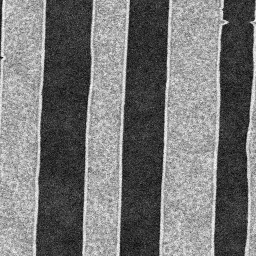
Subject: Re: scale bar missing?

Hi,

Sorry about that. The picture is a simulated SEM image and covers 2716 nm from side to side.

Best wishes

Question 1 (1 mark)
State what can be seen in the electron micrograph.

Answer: one or a few lines or trenches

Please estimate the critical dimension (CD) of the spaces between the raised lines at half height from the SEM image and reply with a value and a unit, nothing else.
453 nm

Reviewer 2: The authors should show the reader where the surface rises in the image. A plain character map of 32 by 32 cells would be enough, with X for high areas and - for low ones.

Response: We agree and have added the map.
XXXXXX------XXXX-----XXXXXXX----
XXXXXX------XXXX-----XXXXXXX----
XXXXXX------XXXX-----XXXXXXX----
XXXXX-------XXXX-----XXXXXXX----
XXXXX-------XXXX-----XXXXXX-----
XXXXX-------XXXX-----XXXXXX-----
XXXXX-------XXXX-----XXXXXX-----
XXXXX-------XXXX-----XXXXXX-----
XXXXX-------XXXX-----XXXXXX-----
XXXXX-------XXX------XXXXXX-----
XXXXX------XXXX------XXXXXX-----
XXXXX------XXXX------XXXXXX-----
XXXXX------XXXX------XXXXXX-----
XXXXX------XXXX------XXXXXX----X
XXXXX------XXXX------XXXXXX----X
XXXXX------XXXX------XXXXXX----X
XXXXX------XXXX------XXXXXX----X
XXXXX------XXXX------XXXXXX----X
XXXXX------XXXX------XXXXXX----X
XXXXX------XXXX------XXXXXX----X
XXXXX------XXXX------XXXXXX----X
XXXXX------XXXX------XXXXXX----X
XXXXX------XXXX-----XXXXXXX----X
XXXXX------XXXX-----XXXXXXX----X
XXXXX------XXXX-----XXXXXXX----X
XXXXX------XXXX-----XXXXXXX----X
XXXX-------XXXX-----XXXXXXX----X
XXXX-------XXXX-----XXXXXXX----X
XXXX-------XXXX-----XXXXXXX----X
XXXX-------XXXX-----XXXXXXX----X
XXXX-------XXXX-----XXXXXXX----X
XXXX-------XXXX-----XXXXXXX----X